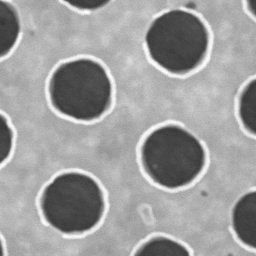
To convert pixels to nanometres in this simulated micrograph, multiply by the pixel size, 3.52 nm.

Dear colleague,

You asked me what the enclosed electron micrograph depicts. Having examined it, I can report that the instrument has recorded holes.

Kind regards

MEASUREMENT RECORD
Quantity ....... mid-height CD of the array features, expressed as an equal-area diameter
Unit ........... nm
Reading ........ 213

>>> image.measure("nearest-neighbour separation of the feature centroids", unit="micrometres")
0.384